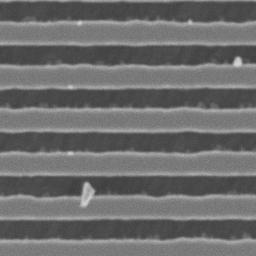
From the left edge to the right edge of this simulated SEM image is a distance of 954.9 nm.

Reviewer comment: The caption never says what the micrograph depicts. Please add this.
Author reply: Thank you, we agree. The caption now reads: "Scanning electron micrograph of lines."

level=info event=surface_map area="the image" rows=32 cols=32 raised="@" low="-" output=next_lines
--------------------------------
--------------------------------
--------------------------------
@@@@@@@@@@@@@@@@@@@@@@@@@@@@@@@@
@@@@@@@@@@@@@@@@@@@@@@@@@@@@@@@@
@@@@@@@@@@@@@@@@@@@@@@@@@@@@@@@@
--------------------------------
-----------------------------@--
@@@@@@@@@@@@@@@@@@@@@@@@@@@@@@@@
@@@@@@@@@@@@@@@@@@@@@@@@@@@@@@@@
@@@@@@@@@@@@@@@@@@@@@@@@@@@@@@@@
--------------------------------
--------------------------------
---@@-----------------@@@-------
@@@@@@@@@@@@@@@@@@@@@@@@@@@@@@@@
@@@@@@@@@@@@@@@@@@@@@@@@@@@@@@@@
--------------------------@@@---
--------------------------------
--------------------------------
@@@@@@@@@@@@@@@@@@@@@@@@@@@@@@@@
@@@@@@@@@@@@@@@@@@@@@@@@@@@@@@@@
@@@@@@@@@@@@@@@@@@@@@@@@@@@@@@@@
--------------------------------
----------@@--------------------
--@-------@@-@--@@---@@---@@@-@@
@@@@@@@@@@@@@@@@@@@@@@@@@@@@@@@@
@@@@@@@@@@@@@@@@@@@@@@@@@@@@@@@@
--------------------------------
--------------------------------
--------------------------------
@@@@@@@@@@@@@@@@@@@@@@@@@@@@@@@@
@@@@@@@@@@@@@@@@@@@@@@@@@@@@@@@@